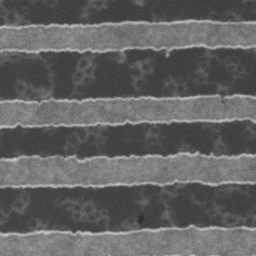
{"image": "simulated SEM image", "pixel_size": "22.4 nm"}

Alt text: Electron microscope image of one or a few lines or trenches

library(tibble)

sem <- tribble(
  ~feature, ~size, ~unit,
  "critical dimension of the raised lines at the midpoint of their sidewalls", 567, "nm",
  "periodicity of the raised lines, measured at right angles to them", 1500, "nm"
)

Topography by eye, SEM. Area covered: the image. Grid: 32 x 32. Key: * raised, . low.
................................
................................
................................
********************************
********************************
********************************
.*..............................
................................
................................
................................
................................
................................
......*....*********************
********************************
********************************
************.**.................
................................
................................
................................
.......*..........**..*****...**
********************************
********************************
********************************
................................
................................
................................
................................
............................*...
.......................**.*...*.
********************************
********************************
********************************